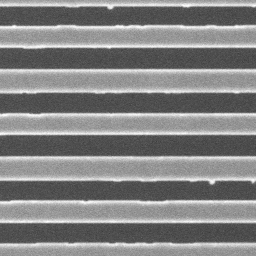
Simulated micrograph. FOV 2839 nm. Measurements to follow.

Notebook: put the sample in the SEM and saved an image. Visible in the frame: lines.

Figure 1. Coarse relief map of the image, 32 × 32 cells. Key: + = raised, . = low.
++++++++++++++++++++++++++++++++
................................
................................
++++++++++++++++++++++++++++++++
++++++++++++++++++++++++++++++++
++++++++++++++++++++++++++++++++
................................
................................
................................
++++++++++++++++++++++++++++++++
++++++++++++++++++++++++++++++++
+++++.......+...................
................................
................................
++++++++++++++++++++++++++++++++
++++++++++++++++++++++++++++++++
++++++++++++++++++++++++++++++++
................................
................................
................................
++++++++++++++++++++++++++++++++
++++++++++++++++++++++++++++++++
..............+..++....++.+.....
................................
................................
++++++++++++++++++++++++++++++++
++++++++++++++++++++++++++++++++
++++++++++++++++++++++++++++++++
................................
................................
....++++++++++++.+.+++..++++++++
++++++++++++++++++++++++++++++++